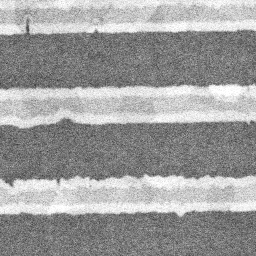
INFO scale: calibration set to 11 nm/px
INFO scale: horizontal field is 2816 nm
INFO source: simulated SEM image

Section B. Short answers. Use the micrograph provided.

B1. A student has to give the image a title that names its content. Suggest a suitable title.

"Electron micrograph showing one or a few lines or trenches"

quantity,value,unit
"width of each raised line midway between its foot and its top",286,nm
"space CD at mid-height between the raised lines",707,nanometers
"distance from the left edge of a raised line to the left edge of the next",992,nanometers